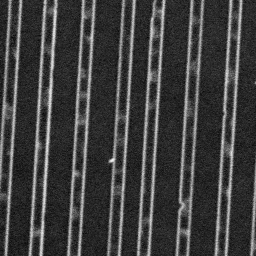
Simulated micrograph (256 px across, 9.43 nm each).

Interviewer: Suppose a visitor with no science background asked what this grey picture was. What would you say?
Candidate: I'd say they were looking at parallel lines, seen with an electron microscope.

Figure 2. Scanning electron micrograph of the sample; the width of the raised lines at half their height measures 104 nanometres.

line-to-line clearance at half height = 256 nm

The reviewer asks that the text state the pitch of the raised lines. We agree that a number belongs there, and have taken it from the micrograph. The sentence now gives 36.9 px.